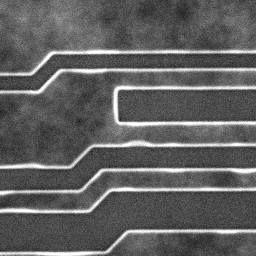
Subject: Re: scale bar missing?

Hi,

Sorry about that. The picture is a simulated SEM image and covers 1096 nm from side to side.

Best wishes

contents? groups of lines, slits or small figures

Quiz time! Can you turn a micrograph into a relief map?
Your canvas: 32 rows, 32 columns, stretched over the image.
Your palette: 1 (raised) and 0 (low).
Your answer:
11111111111111111111111111111111
11111111111111111111111111111111
11111111111111111111111111111111
11111111111111111111111111111111
11111111111111111111111111111111
11111111111111111111111111111111
11111111111111111111111111111111
11111100000000000000000000000000
11111000000000000000000000000000
00000001111111111111111111111111
00000011111111111111111111111111
11111111111111100000000000000000
11111111111111000000000000000000
11111111111111000000000000000000
11111111111111100000000000000000
11111111111111111111111111111111
11111111111111111111111111111111
11111111111111111111111111111111
11111111111000000000000000000000
11111111110000000000000000000000
11111111100000000000000000000000
00000000000011111111111111111111
00000000000111111111111111111111
00000000001111111111111111111111
11111111111110000000000000000000
11111111111100000000000000000000
00000000000000000000000000000000
00000000000000000000000000000000
00000000000000000000000000000000
00000000000000011111111111111111
00000000000000111111111111111111
00000000000001111111111111111111